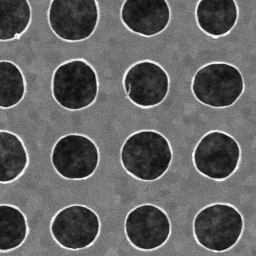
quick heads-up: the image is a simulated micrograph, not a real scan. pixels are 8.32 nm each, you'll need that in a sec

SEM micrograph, a regular array of holes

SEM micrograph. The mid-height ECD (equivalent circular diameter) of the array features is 383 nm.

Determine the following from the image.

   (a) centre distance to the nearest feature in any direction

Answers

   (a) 587 nanometres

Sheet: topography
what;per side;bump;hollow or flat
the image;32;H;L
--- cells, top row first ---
LLLLHHLLLLLLHHHHLLLLLHHHHLLLLHHH
LLLLHHLLLLLLHHHLLLLLLHHHHLLLLLHH
LLLLHHLLLLLLHHHLLLLLLHHHHLLLLLHH
LLLHHHHLLLLLHHHHLLLLLHHHHLLLLHHH
LLHHHHHLLLLHHHHHHHHHHHHHHHHHHHHH
HHHHHHHHHHHHHHHHHHHHHHHHHHHHHHHH
HHHHHHHHHHHHHHHHHHHHHHHHHHHHHHHH
HHHHHHHHHHHHHHHHHHHHHHHHHHHHHHHH
LLHHHHHLLLLHHHHHLLLLHHHHHLLLLHHH
LLLHHHHLLLLLHHHHLLLLLHHHLLLLLLHH
LLLHHHHLLLLLHHHHLLLLLHHHLLLLLLHH
LLLHHHHLLLLLHHHHLLLLLHHHLLLLLLHH
LLHHHHHLLLLLHHHHLLLLHHHHHLLLLHHH
HHHHHHHHLLHHHHHHHHHHHHHHHHHHHHHH
HHHHHHHHHHHHHHHHHHHHHHHHHHHHHHHH
HHHHHHHHHHHHHHHHHHHHHHHHHHHHHHHH
LHHHHHHHHHHHHHHHHLLHHHHHHHHHHHHH
LLHHHHHLLLLHHHHHLLLLLHHHHLLLLHHH
LLLHHHHLLLLLHHHLLLLLLHHHHLLLLLHH
LLLHHHHLLLLLHHHLLLLLLHHHLLLLLLHH
LLLHHHHLLLLLHHHLLLLLLHHHLLLLLLHH
LLLHHHHLLLLLHHHHLLLLLHHHHLLLLHHH
LLHHHHHHHHHHHHHHHHLHHHHHHHHHHHHH
HHHHHHHHHHHHHHHHHHHHHHHHHHHHHHHH
HHHHHHHHHHHHHHHHHHHHHHHHHHHHHHHH
HHHHHHHHHHHHHHHHHHHHHHHHHHHHHHHH
LLLHHHHLLLLLHHHHLLLLHHHHHLLLLLHH
LLLHHHHLLLLLHHHHLLLLLHHHLLLLLLHH
LLLHHHLLLLLLHHHHLLLLLHHHLLLLLLHH
LLLHHHHLLLLLHHHHLLLLLHHHLLLLLLHH
LLLHHHHHLLLHHHHHHLLLHHHHHLLLLHHH
HHHHHHHHHHHHHHHHHHHHHHHHHHHHHHHH